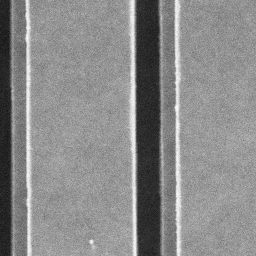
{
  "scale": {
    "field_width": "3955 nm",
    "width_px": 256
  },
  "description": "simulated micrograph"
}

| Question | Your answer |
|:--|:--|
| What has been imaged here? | lines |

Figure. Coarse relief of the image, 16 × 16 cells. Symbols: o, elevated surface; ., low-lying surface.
.ooooooo..oooooo
.ooooooo..oooooo
.ooooooo..oooooo
.ooooooo..oooooo
.ooooooo..oooooo
.ooooooo..oooooo
.ooooooo..oooooo
.ooooooo..oooooo
.ooooooo..oooooo
.ooooooo..oooooo
.ooooooo..oooooo
.ooooooo..oooooo
.ooooooo..oooooo
.ooooooo..oooooo
.ooooooo..oooooo
.ooooooo..oooooo